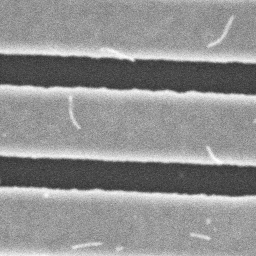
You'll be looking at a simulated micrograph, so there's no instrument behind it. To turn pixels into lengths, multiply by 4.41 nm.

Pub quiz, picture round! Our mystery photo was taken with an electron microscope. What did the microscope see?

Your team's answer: lines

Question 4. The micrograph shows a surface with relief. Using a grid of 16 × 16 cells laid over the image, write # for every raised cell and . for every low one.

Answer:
################
################
################
.....###########
................
#####...........
################
################
################
################
................
................
################
################
################
################